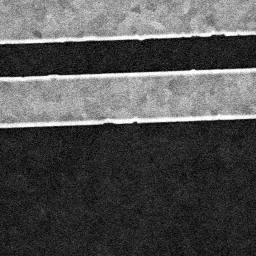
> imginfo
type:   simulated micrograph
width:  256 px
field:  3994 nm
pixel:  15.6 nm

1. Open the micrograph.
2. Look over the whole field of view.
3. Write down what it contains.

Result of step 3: one or a few lines or trenches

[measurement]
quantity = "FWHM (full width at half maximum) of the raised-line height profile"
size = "732 nanometers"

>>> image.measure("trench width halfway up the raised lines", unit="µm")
0.586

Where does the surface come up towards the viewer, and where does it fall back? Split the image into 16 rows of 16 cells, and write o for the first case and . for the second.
oooooooooooooooo
oooooooooooooooo
oooo............
................
............oooo
oooooooooooooooo
oooooooooooooooo
ooooooooooo.....
................
................
................
................
................
................
................
................